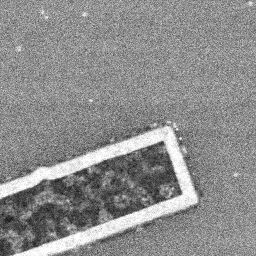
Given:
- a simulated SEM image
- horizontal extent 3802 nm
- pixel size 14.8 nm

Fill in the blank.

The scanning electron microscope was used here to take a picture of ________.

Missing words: one or a few lines or trenches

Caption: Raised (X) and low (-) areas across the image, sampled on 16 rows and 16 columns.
----------------
----------------
----------------
----------------
----------------
----------------
----------------
----------------
----------------
-------XXXX-----
----XXXXXXX-----
-XXXXXXXXXXX----
XXXXXXXXXXXX----
XXXXXXXXX-------
XXXXXX----------
XXX-------------